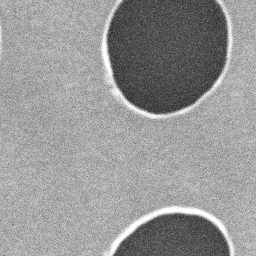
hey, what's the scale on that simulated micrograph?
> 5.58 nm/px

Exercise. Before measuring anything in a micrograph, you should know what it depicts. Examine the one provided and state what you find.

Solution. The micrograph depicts holes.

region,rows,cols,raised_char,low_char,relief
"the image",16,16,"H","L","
HHHHHHHLLLLLLLHH
HHHHHHHLLLLLLLHH
HHHHHHHLLLLLLLHH
HHHHHHHLLLLLLLHH
HHHHHHHLLLLLLLHH
HHHHHHHLLLLLLHHH
HHHHHHHHLLLLHHHH
HHHHHHHHHHHHHHHH
HHHHHHHHHHHHHHHH
HHHHHHHHHHHHHHHH
HHHHHHHHHHHHHHHH
HHHHHHHHHHHHHHHH
HHHHHHHHHHHHHHHH
HHHHHHHHHHLLLHHH
HHHHHHHHLLLLLLHH
HHHHHHHLLLLLLLHH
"